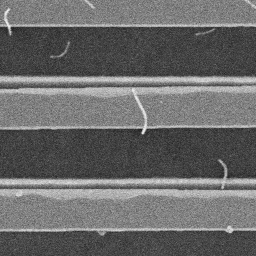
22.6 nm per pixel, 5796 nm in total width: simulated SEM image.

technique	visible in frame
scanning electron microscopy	lines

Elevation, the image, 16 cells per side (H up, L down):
HHHHHHHHHHHHHHHH
HHHHHHHHHHHHHHHH
LLLLLLLLLLLLLLLL
LLLLLLLLLLLLLLLL
LLLLLLLLLLLLLLLL
HHHHHHHHHHHHHHHH
HHHHHHHHHHHHHHHH
HHHHHHHHHHHHHHHH
LLLLLLLLLLLLLLLL
LLLLLLLLLLLLLLLL
LLLLLLLLLLLLLLLL
HHHHHHHHHHHHHHHH
HHHHHHHHHHHHHHHH
HHHHHHHHHHHHHHHH
LLLLLLHLLLLLLLLL
LLLLLLLLLLLLLLLL